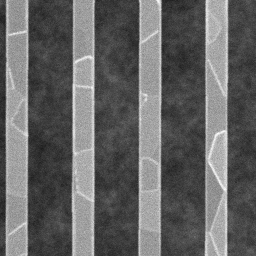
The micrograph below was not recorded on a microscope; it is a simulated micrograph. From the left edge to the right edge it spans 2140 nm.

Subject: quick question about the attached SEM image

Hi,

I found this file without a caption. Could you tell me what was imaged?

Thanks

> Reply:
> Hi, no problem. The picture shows wiring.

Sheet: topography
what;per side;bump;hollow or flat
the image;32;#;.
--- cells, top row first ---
.##......###.....###......##....
.##......###......##......##....
.##......###......##......##....
.##......###......##......##....
.##......###......##......##....
.##......###.....###......##....
.##......###.....###......##....
.##......###.....###......##....
.##......###.....###......##....
.##......###.....###......##....
.##......###.....###......##....
.##..............###......##....
.##..............###......##....
.#...............###......##....
.#...............###......##....
.#...............###......##....
.##..............###......##....
.##..............###......#.....
.##..............###......#.....
.##......###.....###.......#....
.##......###.....###............
.##......###.....###......#.....
.##......###.....###......#.....
.##......###.....###......##....
.##......###.....###......##....
.##......###.....###......##....
.##......###.....###......##....
.##......###.....###......##....
.##......###.....###......##....
.##......###.....###......##....
.##......###.....###......##....
.##......###.....###......##....